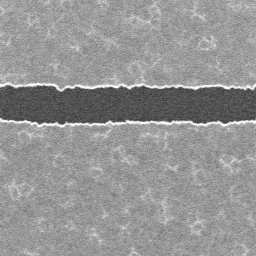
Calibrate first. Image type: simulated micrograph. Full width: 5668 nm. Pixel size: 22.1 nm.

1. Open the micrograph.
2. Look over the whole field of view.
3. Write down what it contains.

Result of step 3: one or a few lines or trenches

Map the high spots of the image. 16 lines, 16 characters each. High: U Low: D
UUUUUUUUUUUUUUUU
UUUUUUUUUUUUUUUU
UUUUUUUUUUUUUUUU
UUUUUUUUUUUUUUUU
UUUUUUUUUUUUUUUU
DDDDDDDDDDDDDDDD
DDDDDDDDDDDDDDDD
DDDDDDDDDDDDDDDD
UUUUUUUUUUUUUUUU
UUUUUUUUUUUUUUUU
UUUUUUUUUUUUUUUU
UUUUUUUUUUUUUUUU
UUUUUUUUUUUUUUUU
UUUUUUUUUUUUUUUU
UUUUUUUUUUUUUUUU
UUUUUUUUUUUUUUUU